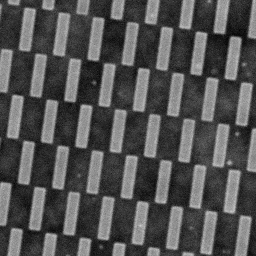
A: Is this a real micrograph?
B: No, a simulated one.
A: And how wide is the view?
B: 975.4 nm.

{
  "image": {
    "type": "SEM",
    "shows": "groups of lines, slits or small figures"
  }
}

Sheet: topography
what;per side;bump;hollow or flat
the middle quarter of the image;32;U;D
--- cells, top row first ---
DUUUDDDDDDUUUDDDDDDDDDDUUUDDDDDD
DUUUDDDDDDUUUDDDDDDUUDDDDDDDDDDD
DUUUDDDDDDUUDDDDDDDUUDDDDDDUUDDD
DUUDDDDDDDUUDDDDDDUUUDDDDDDUUUDD
DUUDDDDDDUUUDDDDDDUUUDDDDDDUUUDD
DUUDDDDDDUUUDDDDDDUUUDDDDDDUUDDD
DUUDDDDDDUUUDDDDDDUUUDDDDDDUUDDD
UUUDDDDDDUUUDDDDDDUUDDDDDDDUUDDD
UUUDDDDDDUUUDDDDDDUUDDDDDDUUUDDD
DDDDDDDDDUUUDDDDDDUUDDDDDDUUUDDD
DDDDUUDDDDDDDDDDDDUUDDDDDDUUUDDD
DDDDUUUDDDDDDUDDDDUUDDDDDDUUUDDD
DDDDUUUDDDDDDUUDDDDDDDDDDDUUDDDD
DDDDUUDDDDDDDUUDDDDDDUUUDDDDDDDD
DDDDUUDDDDDDUUUDDDDDDUUUDDDDDDUU
DDDDUUDDDDDDUUUDDDDDDUUUDDDDDDUU
DDDDUUDDDDDDUUUDDDDDDUUUDDDDDDUU
DDDUUUDDDDDDUUUDDDDDDUUDDDDDDDUU
DDDUUUDDDDDDUUDDDDDDDUUDDDDDDUUU
DDDUUUDDDDDDUUDDDDDDUUUDDDDDDUUU
DDDUUUDDDDDDUUDDDDDDUUUDDDDDDUUU
UDDDDDDDDDDDUUDDDDDDUUUDDDDDDUUU
UDDDDDDUUUDDDDDDDDDDUUUDDDDDDUUD
UDDDDDDUUDDDDDDDUUDDDDDDDDDDDUUD
UDDDDDDUUDDDDDDUUUDDDDDDUUDDDDDD
UDDDDDDUUDDDDDDUUUDDDDDDUUUDDDDD
DDDDDDUUUDDDDDDUUUDDDDDDUUUDDDDD
DDDDDDUUUDDDDDDUUUDDDDDDUUDDDDDD
DDDDDDUUUDDDDDDUUDDDDDDDUUDDDDDD
DDDDDDUUUDDDDDDUUDDDDDDUUUDDDDDD
DDDDDDUUUDDDDDDUUDDDDDDUUUDDDDDD
DDDDDDUUDDDDDDDUUDDDDDDUUUDDDDDD